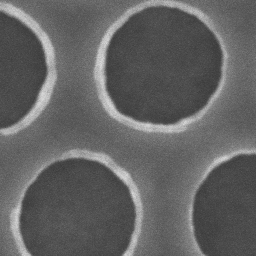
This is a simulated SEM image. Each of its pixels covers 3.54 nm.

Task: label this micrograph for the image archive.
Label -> holes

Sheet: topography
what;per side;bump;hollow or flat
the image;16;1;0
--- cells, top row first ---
1111111110011111
0011111100000111
0011111000000011
0001111000000011
0001110000000011
0001111000000011
0011111000000111
0111111100001111
1111111111111111
1111111111111111
1110000111111000
1100000011111000
1000000011110000
1000000011110000
1000000011110000
1100000011110000